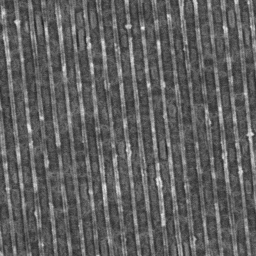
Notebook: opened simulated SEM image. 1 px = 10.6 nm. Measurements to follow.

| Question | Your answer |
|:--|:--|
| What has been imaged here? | parallel lines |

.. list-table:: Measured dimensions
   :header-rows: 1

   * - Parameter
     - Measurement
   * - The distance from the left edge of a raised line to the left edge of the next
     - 0.146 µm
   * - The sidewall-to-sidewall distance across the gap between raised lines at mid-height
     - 106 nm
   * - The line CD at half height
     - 3.6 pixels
